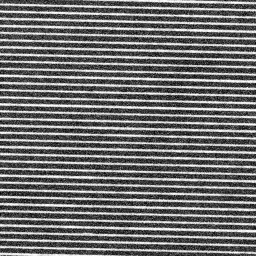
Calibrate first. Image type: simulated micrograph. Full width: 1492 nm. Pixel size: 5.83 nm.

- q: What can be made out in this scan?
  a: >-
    parallel lines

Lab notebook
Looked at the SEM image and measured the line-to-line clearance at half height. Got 5.37 pixels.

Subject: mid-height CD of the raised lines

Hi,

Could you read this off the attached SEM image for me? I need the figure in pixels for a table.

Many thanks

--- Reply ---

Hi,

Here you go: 1.37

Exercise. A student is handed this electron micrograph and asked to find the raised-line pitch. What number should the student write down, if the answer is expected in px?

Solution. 7.14